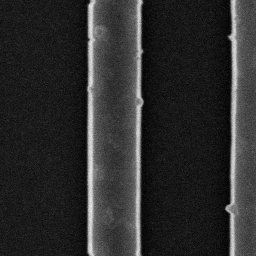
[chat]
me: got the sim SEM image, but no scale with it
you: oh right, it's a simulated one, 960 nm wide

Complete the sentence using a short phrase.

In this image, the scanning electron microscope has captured one or a few lines or trenches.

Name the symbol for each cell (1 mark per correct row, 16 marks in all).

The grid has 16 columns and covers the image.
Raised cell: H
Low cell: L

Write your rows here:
LLLLLLHHHLLLLLLH
LLLLLLHHHLLLLLLH
LLLLLLHHHLLLLLLH
LLLLLLHHHLLLLLLH
LLLLLLHHHLLLLLLH
LLLLLLHHHLLLLLLH
LLLLLLHHHLLLLLLH
LLLLLLHHHLLLLLLH
LLLLLLHHHLLLLLLH
LLLLLLHHHLLLLLLH
LLLLLLHHHLLLLLLH
LLLLLLHHHLLLLLLH
LLLLLLHHHLLLLLHH
LLLLLLHHHLLLLLHH
LLLLLLHHHLLLLLHH
LLLLLLHHHLLLLLHH